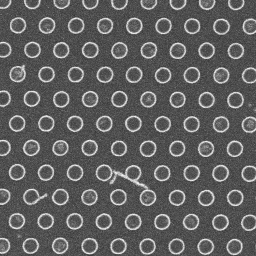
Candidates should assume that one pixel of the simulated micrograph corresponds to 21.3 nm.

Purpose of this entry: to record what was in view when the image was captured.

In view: a regular array of raised bodies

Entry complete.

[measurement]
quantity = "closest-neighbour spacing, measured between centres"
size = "600 nm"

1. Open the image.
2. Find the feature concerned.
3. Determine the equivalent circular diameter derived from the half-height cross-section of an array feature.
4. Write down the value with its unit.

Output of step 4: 327 nanometres